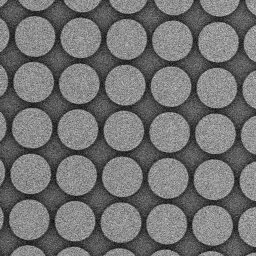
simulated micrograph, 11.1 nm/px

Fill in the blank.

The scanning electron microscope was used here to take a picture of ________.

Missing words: an array of small figures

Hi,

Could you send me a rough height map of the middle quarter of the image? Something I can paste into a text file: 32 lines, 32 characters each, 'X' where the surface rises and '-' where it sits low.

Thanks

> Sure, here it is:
--XXXX--------XXX---------------
XXXXXXX-----XXXXXXX-----XXXXXX--
XXXXXXXX---XXXXXXXXX---XXXXXXXX-
XXXXXXXXX--XXXXXXXXX--XXXXXXXXX-
XXXXXXXXX-XXXXXXXXXX--XXXXXXXXXX
XXXXXXXXX-XXXXXXXXXX--XXXXXXXXXX
XXXXXXXXX-XXXXXXXXXX--XXXXXXXXXX
XXXXXXXX---XXXXXXXXX--XXXXXXXXX-
XXXXXXX----XXXXXXXX----XXXXXXXX-
--XXXX-------XXXXX------XXXXXX--
---------------------------X----
---X----------------------------
XXXXXXX-----XXXXXX------XXXX----
XXXXXXXX---XXXXXXXX----XXXXXXX--
XXXXXXXX---XXXXXXXX---XXXXXXXXX-
XXXXXXXX--XXXXXXXXXX--XXXXXXXXX-
XXXXXXXX--XXXXXXXXXX-XXXXXXXXXX-
XXXXXXXX--XXXXXXXXXX-XXXXXXXXXX-
XXXXXXXX--XXXXXXXXXX--XXXXXXXXX-
XXXXXXX----XXXXXXXX---XXXXXXXXX-
-XXXXX------XXXXXX-----XXXXXXX--
-------------XXXX-------XXXXX---
--------------------------------
-XXXXX-------XXX----------------
XXXXXXX----XXXXXXX-----XXXXXX---
XXXXXXXX--XXXXXXXXX---XXXXXXXX--
XXXXXXXX--XXXXXXXXX---XXXXXXXXX-
XXXXXXXX--XXXXXXXXX--XXXXXXXXXX-
XXXXXXXX--XXXXXXXXX--XXXXXXXXXX-
XXXXXXXX--XXXXXXXXX--XXXXXXXXXX-
XXXXXXX---XXXXXXXXX---XXXXXXXXX-
XXXXXXX----XXXXXXX----XXXXXXXX--